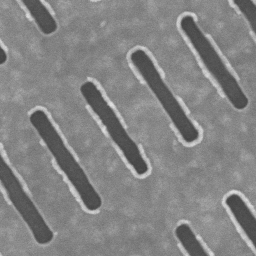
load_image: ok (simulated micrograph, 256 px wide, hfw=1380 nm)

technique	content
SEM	holes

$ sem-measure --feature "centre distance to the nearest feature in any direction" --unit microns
0.318